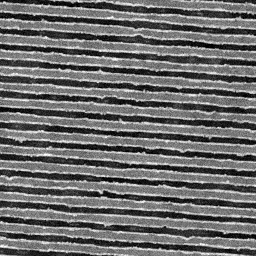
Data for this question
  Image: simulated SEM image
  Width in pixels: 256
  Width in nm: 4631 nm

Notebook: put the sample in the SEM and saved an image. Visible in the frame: parallel lines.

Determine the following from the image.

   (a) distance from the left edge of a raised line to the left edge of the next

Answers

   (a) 0.284 microns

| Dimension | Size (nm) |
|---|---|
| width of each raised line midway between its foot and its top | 169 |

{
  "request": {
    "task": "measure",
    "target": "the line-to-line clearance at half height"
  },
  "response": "122 nanometres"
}